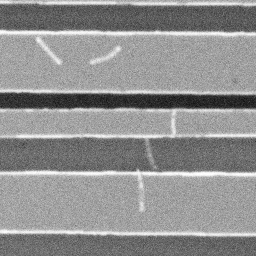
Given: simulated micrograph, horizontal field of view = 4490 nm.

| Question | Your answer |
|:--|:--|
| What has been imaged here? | lines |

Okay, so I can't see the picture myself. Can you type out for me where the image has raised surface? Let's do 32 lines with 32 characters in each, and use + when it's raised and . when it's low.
................++++++++++++++++
................................
................................
................................
++++++++++++++++++++++++++++++++
++++++++++++++++++++++++++++++++
++++++++++++++++++++++++++++++++
++++++++++++++++++++++++++++++++
++++++++++++++++++++++++++++++++
++++++++++++++++++++++++++++++++
++++++++++++++++++++++++++++++++
.......+++++++++++++++++++++++++
................................
................................
++++++++++++++++++++++++++++++++
++++++++++++++++++++++++++++++++
++++++++++++++++++++++++++++++++
................................
................................
................................
................................
.................+..............
++++++++++++++++++++++++++++++++
++++++++++++++++++++++++++++++++
++++++++++++++++++++++++++++++++
++++++++++++++++++++++++++++++++
++++++++++++++++++++++++++++++++
++++++++++++++++++++++++++++++++
++++++++++++++++++++++++++++++++
................................
................................
................................